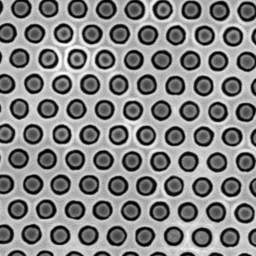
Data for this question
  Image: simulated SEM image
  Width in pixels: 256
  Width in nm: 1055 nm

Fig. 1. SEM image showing a regular array of ring-shaped grooves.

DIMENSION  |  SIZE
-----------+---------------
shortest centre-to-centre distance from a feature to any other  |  115 nm